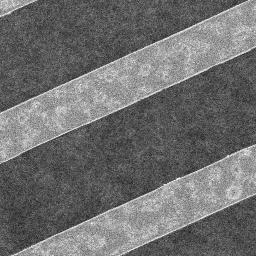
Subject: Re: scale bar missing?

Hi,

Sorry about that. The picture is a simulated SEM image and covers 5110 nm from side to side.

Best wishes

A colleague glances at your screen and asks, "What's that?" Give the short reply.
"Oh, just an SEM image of one or a few lines or trenches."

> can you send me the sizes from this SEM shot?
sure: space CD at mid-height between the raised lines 1780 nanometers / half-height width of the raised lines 891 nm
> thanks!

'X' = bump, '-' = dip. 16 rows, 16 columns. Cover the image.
X--------------X
------------XXXX
----------XXXXXX
--------XXXXXXX-
------XXXXXXX---
----XXXXXX------
-XXXXXXX--------
XXXXXX----------
XXXX------------
XX-------------X
-------------XXX
----------XXXXXX
--------XXXXXXX-
------XXXXXXX---
----XXXXXXX-----
--XXXXXX--------